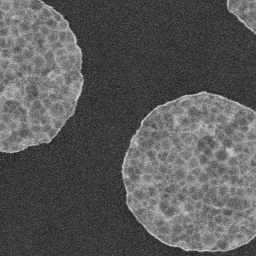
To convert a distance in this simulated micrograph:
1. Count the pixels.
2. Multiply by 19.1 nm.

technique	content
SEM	raised bodies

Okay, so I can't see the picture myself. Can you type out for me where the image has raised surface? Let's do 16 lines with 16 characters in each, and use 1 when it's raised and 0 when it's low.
1110000000000011
1111000000000001
1111100000000000
1111100000000000
1111100000000000
1111100000000000
1111100000111110
1111000001111111
1110000011111111
0000000011111111
0000000011111111
0000000011111111
0000000011111111
0000000011111111
0000000001111111
0000000000011110